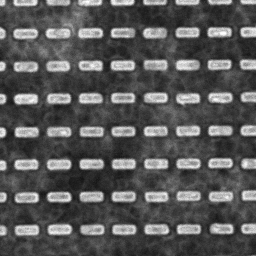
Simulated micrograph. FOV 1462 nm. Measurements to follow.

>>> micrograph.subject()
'a regular array of raised bodies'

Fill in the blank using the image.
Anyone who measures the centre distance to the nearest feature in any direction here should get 182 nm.